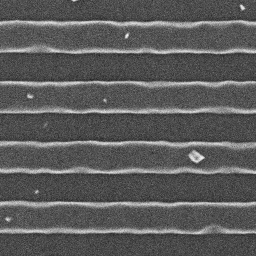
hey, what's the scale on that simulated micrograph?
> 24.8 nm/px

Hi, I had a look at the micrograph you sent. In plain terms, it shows wiring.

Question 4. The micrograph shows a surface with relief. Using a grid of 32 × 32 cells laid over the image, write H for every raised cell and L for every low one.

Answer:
LLLLLLLLLLLLLLLLLLLLLLLLLLLLLLLL
LLLLLLLLLLLLLLLLLLLLLLLLLLLLLLLL
LLLLLLLLLLLLLLLLLLLLLLLLLLLLLLLL
HHHHHHHHHHHHHHHHHHHHHHHHHHHHHHHH
HHHHHHHHHHHHHHHHHHHHHHHHHHHHHHHH
HHHHHHHHHHHHHHHHHHHHHHHHHHHHHHHH
LLLLLLLLHHLLLLLLLLLHHLLLLLHHHLLL
LLLLLLLLLLLLLLLLLLLLLLLLLLLLLLLL
LLLLLLLLLLLLLLLLLLLLLLLLLLLLLLLL
LLLLLLLLLLLLLLLLLLLLLLLLLLLLLLLL
HHHHHHHHHHHHHHHHHHHHHHHHHHLHHHHH
HHHHHHHHHHHHHHHHHHHHHHHHHHHHHHHH
HHHHHHHHHHHHHHHHHHHHHHHHHHHHHHHH
HHHHHHHHHHHHHHHHHHHHHHHHHHHHHHHH
LLLLLLLLLLLLLLLLLLLLLLLLLLLLLLLL
LLLLLLLLLLLLLLLLLLLLLLLLLLLLLLLL
LLLLLLLLLLLLLLLLLLLLLLLLLLLLLLLL
LLLLLLLLLLLLLLLLLLLLLLLLLLLLLLLL
HHHHHHHHHHHHHHHHHHHHHHHHHHHHHHHH
HHHHHHHHHHHHHHHHHHHHHHHHHHHHHHHH
HHHHHHHHHHHHHHHHHHHHHHHHHHHHHHHH
LLLLLLLHLLLLHHHLLLLLLHLLLHHLLLLH
LLLLLLLLLLLLLLLLLLLLLLLLLLLLLLLL
LLLLLLLLLLLLLLLLLLLLLLLLLLLLLLLL
LLLLLLLLLLLLLLLLLLLLLLLLLLLLLLLL
HHHHLLHHHHHHLHHHHHHHLLHHHHHHHHHH
HHHHHHHHHHHHHHHHHHHHHHHHHHHHHHHH
HHHHHHHHHHHHHHHHHHHHHHHHHHHHHHHH
HHHHHHHHHHHHHHHHHHHHHHHHHHHHHHHH
LLLLLLLLLLLLLLLLLLLLLLLLLLLLLLLL
LLLLLLLLLLLLLLLLLLLLLLLLLLLLLLLL
LLLLLLLLLLLLLLLLLLLLLLLLLLLLLLLL